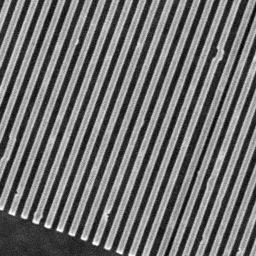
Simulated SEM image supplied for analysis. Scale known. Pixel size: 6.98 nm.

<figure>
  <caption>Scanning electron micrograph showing parallel lines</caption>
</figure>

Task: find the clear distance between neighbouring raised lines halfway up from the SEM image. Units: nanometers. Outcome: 50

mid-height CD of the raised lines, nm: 43.5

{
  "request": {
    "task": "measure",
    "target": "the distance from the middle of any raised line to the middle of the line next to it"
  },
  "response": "0.0886 um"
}